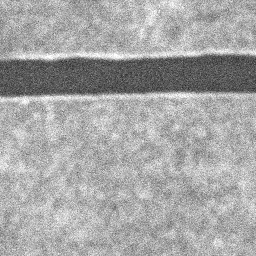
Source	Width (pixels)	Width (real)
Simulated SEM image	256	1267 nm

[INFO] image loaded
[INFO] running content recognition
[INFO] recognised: one or a few lines or trenches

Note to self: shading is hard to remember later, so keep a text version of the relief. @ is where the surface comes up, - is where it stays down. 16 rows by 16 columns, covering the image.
@@@@@@@@@@@@@@@@
@@@@@@@@@@@@@@@@
@@@@@@@@@@@@@@@@
@@@@--@@@@------
----------------
----------------
@@@@@@@@@@@@@@@@
@@@@@@@@@@@@@@@@
@@@@@@@@@@@@@@@@
@@@@@@@@@@@@@@@@
@@@@@@@@@@@@@@@@
@@@@@@@@@@@@@@@@
@@@@@@@@@@@@@@@@
@@@@@@@@@@@@@@@@
@@@@@@@@@@@@@@@@
@@@@@@@@@@@@@@@@